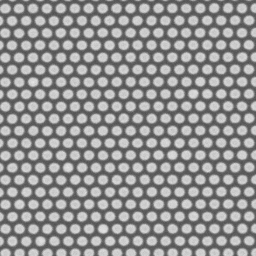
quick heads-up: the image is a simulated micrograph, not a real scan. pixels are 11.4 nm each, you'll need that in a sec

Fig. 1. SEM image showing a regular array of raised bodies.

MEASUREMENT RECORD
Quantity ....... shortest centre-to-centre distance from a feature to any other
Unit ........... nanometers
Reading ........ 156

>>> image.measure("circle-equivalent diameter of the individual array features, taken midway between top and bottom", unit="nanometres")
106